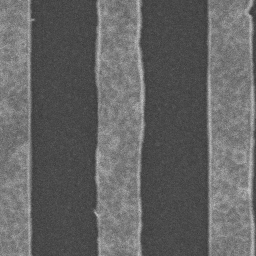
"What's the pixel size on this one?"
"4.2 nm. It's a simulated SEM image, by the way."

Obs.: one or a few lines or trenches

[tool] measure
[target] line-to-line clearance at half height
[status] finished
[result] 69.8 px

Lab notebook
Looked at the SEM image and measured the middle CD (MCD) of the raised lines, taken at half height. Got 172 nm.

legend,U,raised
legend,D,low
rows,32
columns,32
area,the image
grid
UUUDDDDDDDDDUUUUUDDDDDDDDDUUUUUD
UUUUDDDDDDDDUUUUUDDDDDDDDDUUUUUD
UUUUDDDDDDDDDUUUUDDDDDDDDDUUUUUD
UUUUDDDDDDDDDUUUUDDDDDDDDDUUUUUD
UUUUDDDDDDDDUUUUUDDDDDDDDDUUUUUD
UUUUDDDDDDDDUUUUUDDDDDDDDDUUUUUD
UUUUDDDDDDDDUUUUUDDDDDDDDDUUUUUD
UUUUDDDDDDDDUUUUUDDDDDDDDDUUUUUD
UUUUDDDDDDDDUUUUUDDDDDDDDDUUUUUD
UUUUDDDDDDDDUUUUUUDDDDDDDDUUUUUU
UUUUDDDDDDDDUUUUUUDDDDDDDDUUUUUU
UUUUDDDDDDDDUUUUUUDDDDDDDDUUUUUU
UUUUDDDDDDDDUUUUUUDDDDDDDDUUUUUU
UUUUDDDDDDDDUUUUUUDDDDDDDDUUUUUU
UUUUDDDDDDDDUUUUUUDDDDDDDDUUUUUU
UUUUDDDDDDDDUUUUUUDDDDDDDDUUUUUD
UUUUDDDDDDDDUUUUUUDDDDDDDDUUUUUU
UUUUDDDDDDDDUUUUUDDDDDDDDDUUUUUD
UUUUDDDDDDDDUUUUUDDDDDDDDDUUUUUD
UUUUDDDDDDDDUUUUUDDDDDDDDDUUUUUD
UUUUDDDDDDDDUUUUUDDDDDDDDDUUUUUD
UUUUDDDDDDDDUUUUUDDDDDDDDDUUUUUD
UUUUDDDDDDDDUUUUUDDDDDDDDDUUUUUD
UUUUDDDDDDDDUUUUUDDDDDDDDDUUUUUD
UUUUDDDDDDDDUUUUUDDDDDDDDDUUUUUD
UUUUDDDDDDDDUUUUUDDDDDDDDDUUUUUD
UUUUDDDDDDDDUUUUUDDDDDDDDDUUUUUD
UUUUDDDDDDDDUUUUUDDDDDDDDDUUUUUD
UUUUDDDDDDDDUUUUUDDDDDDDDDUUUUUD
UUUUDDDDDDDDUUUUUDDDDDDDDDUUUUUU
UUUUDDDDDDDDUUUUUDDDDDDDDDUUUUUU
UUUUDDDDDDDDUUUUUDDDDDDDDDUUUUUD